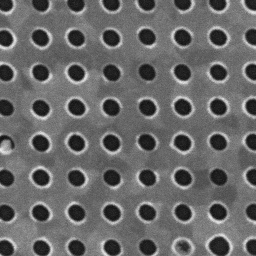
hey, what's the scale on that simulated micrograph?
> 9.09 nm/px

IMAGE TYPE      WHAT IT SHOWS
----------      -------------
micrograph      a regular array of holes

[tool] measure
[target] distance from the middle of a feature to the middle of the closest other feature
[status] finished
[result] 315 nm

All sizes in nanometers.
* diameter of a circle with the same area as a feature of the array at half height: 159